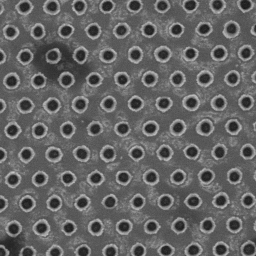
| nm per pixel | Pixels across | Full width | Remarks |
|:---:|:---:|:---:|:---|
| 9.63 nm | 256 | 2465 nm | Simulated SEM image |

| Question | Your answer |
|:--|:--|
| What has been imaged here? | a regular array of holes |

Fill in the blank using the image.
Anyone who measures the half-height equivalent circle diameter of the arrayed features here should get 109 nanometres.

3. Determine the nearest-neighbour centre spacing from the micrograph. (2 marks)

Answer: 264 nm